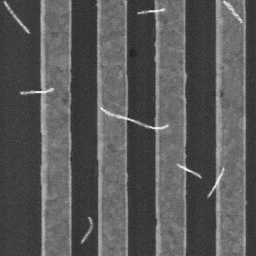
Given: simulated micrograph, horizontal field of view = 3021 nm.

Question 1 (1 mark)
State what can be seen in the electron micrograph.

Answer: lines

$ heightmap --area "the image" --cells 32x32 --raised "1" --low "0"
00000111100011110000111000011110
00000111100011110001111000011110
00000111100011110000111000011110
00000111100011110000111000011110
00000111100011110000111000011110
00000111100011110000111000011110
00000111100011110000111000011110
00000111100011110000111000011110
00000111100011110000111000011110
00000111100011110000111000011110
00000111100011110000111000011110
00000111100011110000111000011110
00000111100011110000111000011110
00000111100011110000111000011110
00000111100011110000111000011110
00000111100011110001111000011110
00000111100011110000111000011110
00000111100011110000111000011110
00000111100011110000111000011110
00000011100011110000111000011110
00000111100011110000111000011110
00000111100011110000111000011110
00000111100011110000111000011110
00000111100011110000111000011110
00000111100011110000111000011110
00000111100011110000111000011110
00000111100011110000111000011110
00000111100011110000111000011110
00000111100011110000111000011110
00000111100011110000111000011110
00000111100011110000111000011110
00000111100011110000111000011110